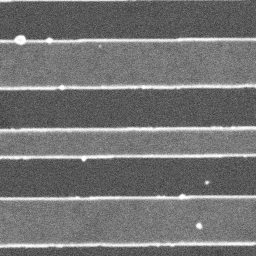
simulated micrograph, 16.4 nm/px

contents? lines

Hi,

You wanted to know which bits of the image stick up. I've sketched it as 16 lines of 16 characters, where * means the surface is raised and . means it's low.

................
................
.*.........*****
****************
****************
****............
................
................
****************
****************
................
................
****************
****************
****************
................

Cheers